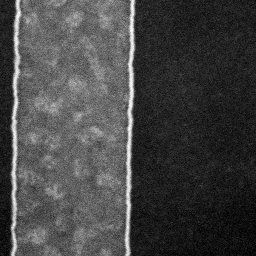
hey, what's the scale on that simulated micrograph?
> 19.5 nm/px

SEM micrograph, one or a few lines or trenches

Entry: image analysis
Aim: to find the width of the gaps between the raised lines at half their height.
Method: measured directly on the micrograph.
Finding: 2.23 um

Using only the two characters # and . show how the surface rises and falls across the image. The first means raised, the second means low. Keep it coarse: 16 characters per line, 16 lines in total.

#.......########
#.......########
#.......########
#.......########
#.......########
#.......########
#.......########
#.......########
#.......########
#.......########
#.......########
#.......########
#.......########
#.......########
#.......########
#.......########